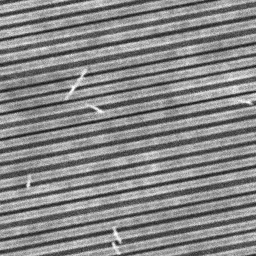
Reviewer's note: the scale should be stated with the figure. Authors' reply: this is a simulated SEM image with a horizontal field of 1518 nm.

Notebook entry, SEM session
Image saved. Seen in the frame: parallel lines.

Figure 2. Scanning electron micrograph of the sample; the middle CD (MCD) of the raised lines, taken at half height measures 6.88 pixels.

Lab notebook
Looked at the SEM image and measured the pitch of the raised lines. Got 72.9 nanometers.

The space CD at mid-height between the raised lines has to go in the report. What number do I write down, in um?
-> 0.0306